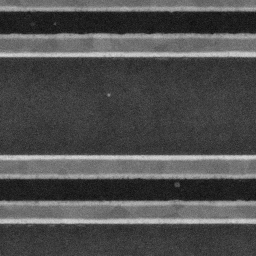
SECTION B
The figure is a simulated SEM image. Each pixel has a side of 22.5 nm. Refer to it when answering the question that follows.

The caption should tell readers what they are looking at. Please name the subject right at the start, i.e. lines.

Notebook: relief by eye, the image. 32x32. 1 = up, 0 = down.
11111111111111111111111111111111
00000000000000000000000000000000
00000000000000000000000000000000
00000000000000000000000000000000
11111111111111111111111111111111
11111111111111111111111111111111
11111111111111111111111111111111
00000000000000000000000000000000
00000000000000000000000000000000
00000000000000000000000000000000
00000000000000000000000000000000
00000000000000000000000000000000
00000000000000000000000000000000
00000000000000000000000000000000
00000000000000000000000000000000
00000000000000000000000000000000
00000000000000000000000000000000
00000000000000000000000000000000
00000000000000000000000000000000
00000000000000000000000000000000
11111111111111111111111111111111
11111111111111111111111111111111
00000000000000000000000000000000
00000000000000000000000000000000
00000000000000000000000000000000
11111111111111111111111111111111
11111111111111111111111111111111
11111111111111111111111111111111
00000000000000000000000000000000
00000000000000000000000000000000
00000000000000000000000000000000
00000000000000000000000000000000